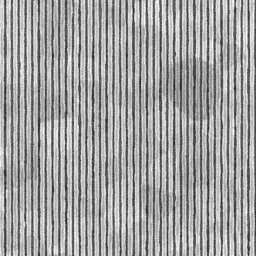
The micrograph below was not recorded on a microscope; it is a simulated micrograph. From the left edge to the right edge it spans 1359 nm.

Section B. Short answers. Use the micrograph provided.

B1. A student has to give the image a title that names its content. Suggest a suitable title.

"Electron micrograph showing parallel lines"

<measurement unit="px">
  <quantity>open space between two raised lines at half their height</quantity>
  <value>3.5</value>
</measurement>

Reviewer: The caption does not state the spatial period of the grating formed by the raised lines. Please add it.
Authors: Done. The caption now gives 6.76 px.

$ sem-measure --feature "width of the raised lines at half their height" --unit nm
19.3